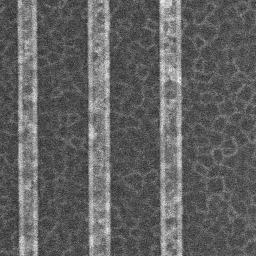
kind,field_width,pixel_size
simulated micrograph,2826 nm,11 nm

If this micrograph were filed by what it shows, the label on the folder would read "one or a few lines or trenches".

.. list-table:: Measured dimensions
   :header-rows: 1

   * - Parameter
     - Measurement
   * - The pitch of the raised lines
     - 790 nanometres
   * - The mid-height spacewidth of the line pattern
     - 613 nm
